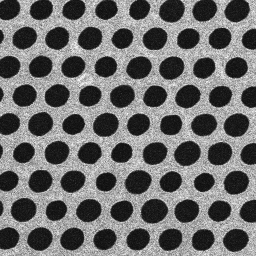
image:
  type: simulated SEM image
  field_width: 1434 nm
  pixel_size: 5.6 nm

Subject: a regular array of holes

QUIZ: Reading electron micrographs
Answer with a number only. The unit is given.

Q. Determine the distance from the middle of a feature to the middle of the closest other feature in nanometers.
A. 182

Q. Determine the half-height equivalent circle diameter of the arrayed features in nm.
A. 127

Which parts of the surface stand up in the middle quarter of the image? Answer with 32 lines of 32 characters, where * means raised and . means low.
.....***.....***......**......**
.....***.....**.......**......**
....****....****.....***.....***
*****************...*****...****
********************************
******.*******..******..******..
.***.....***.....****....****...
.***.....***......**......**....
.***.....**.......**......**....
.***.....***.....***.....***....
*****..******...*****...*****...
********************************
**.******...******.*************
*....***.....****....****....***
.....***......**.....***.....***
.....**.......**.....***.....***
.....***.....***.....***.....***
*..*****....*****...*****...****
********************************
***********************.******..
.***.....****....****....****...
.***.....***.....***......**....
.**......***.....***......**....
.***.....***.....***.....***....
*****...*****..*****....****....
******************************.*
********************************
.....****...****.....****....***
.....***.....***......**.....***
.....***.....**.......**.....***
.....***.....**......***.....***
....*****...****.....****...****